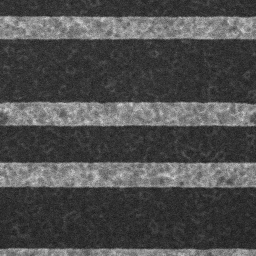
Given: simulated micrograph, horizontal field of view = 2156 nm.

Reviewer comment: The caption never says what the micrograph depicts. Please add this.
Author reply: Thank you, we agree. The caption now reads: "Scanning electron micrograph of one or a few lines or trenches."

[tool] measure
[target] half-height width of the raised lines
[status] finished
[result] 22.3 px